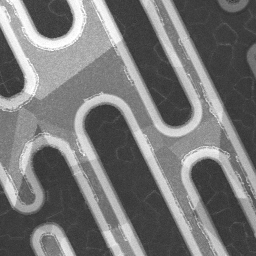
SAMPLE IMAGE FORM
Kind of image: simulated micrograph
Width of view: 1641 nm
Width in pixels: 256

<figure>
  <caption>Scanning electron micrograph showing one or a few lines or trenches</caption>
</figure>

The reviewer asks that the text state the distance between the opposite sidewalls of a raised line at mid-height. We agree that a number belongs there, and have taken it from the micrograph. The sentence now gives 127 nm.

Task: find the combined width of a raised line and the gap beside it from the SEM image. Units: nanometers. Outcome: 429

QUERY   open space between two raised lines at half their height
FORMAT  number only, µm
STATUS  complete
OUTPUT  0.285